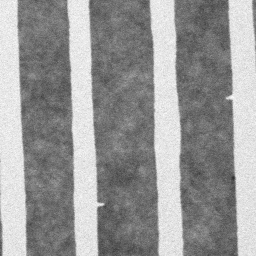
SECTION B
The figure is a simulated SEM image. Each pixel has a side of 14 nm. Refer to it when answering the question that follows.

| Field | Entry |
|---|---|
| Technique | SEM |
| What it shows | one or a few lines or trenches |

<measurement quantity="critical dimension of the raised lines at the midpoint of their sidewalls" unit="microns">0.312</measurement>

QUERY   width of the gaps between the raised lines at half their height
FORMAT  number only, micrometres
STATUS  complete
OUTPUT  0.776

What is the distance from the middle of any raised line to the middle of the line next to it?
1.15 um